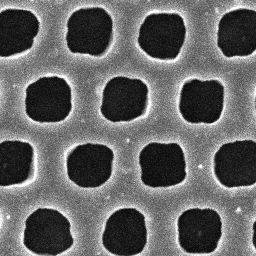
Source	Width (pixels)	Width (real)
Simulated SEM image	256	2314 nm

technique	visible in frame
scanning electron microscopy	a regular array of holes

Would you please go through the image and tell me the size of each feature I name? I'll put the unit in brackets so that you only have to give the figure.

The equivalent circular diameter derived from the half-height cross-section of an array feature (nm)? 435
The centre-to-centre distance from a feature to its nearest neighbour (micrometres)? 0.663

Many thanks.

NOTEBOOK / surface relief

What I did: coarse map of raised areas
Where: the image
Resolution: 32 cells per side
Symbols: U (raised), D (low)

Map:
UUUUUUUUUUUUUUUUUUUUUUUUUUUUUUUU
DDDDUUUUUDDDDDUUUUUUUUUUUUUUUDDD
DDDDDUUUUDDDDDUUUUDDDDDUUUUDDDDD
DDDDDUUUDDDDDDUUUUDDDDDUUUUDDDDD
DDDDUUUUDDDDDDUUUDDDDDDUUUUDDDDD
DDDDUUUUDDDDDDUUUDDDDDDUUUUDDDDD
DDDUUUUUUDDDDUUUUUDDDDUUUUUUDDDD
UUUUUUUUUUUUUUUUUUUUUUUUUUUUUUUU
UUUUUUUUUUUUUUUUUUUUUUUUUUUUUUUU
UUUUUUUUUUUUUUUUUUUUUUUUUUUUUUUU
UUUUDDDDUUUUUDDDDDUUUUUDDDDDUUUU
UUUDDDDDDUUUUDDDDDDUUUUDDDDDUUUU
UUUDDDDDDUUUUDDDDDDUUUDDDDDDUUUU
UUUDDDDDDUUUUDDDDDUUUUDDDDDDUUUU
UUUUDDDDUUUUUDDDDDUUUUUDDDDUUUUU
UUUUUUUUUUUUUUUUUUUUUUUUUUUUUUUU
UUUUUUUUUUUUUUUUUUUUUUUUUUUUUUUU
UDUUUUUUUUUUUUUUUUUUUUUUUUUUUUUU
DDDDUUUUUDDDDDUUUUDDDDDUUUUDDDDD
DDDDUUUUDDDDDDUUUDDDDDDUUUUDDDDD
DDDDUUUUDDDDDDUUUDDDDDDUUUUDDDDD
DDDDUUUUDDDDDDUUUUDDDDDUUUUDDDDD
DDDUUUUUUDDDDUUUUUDDDDDUUUUDDDDD
UUUUUUUUUUUUUUUUUUUUUUUUUUUUUUUU
UUUUUUUUUUUUUUUUUUUUUUUUUUUUUUUU
UUUUUUUUUUUUUUUUUUUUUUUUUUUUUUUU
UUUUDDDUUUUUUUDDDUUUUUUDDDDUUUUU
UUUDDDDDDUUUUDDDDDUUUUDDDDDDUUUU
UUUDDDDDDUUUUDDDDDUUUUDDDDDDUUUU
UUUDDDDDDUUUUDDDDDUUUUDDDDDDUUUU
UUUDDDDDDUUUUDDDDDUUUUDDDDDUUUUU
UUUUDDDDUUUUUUDDDDUUUUUDDDUUUUUU